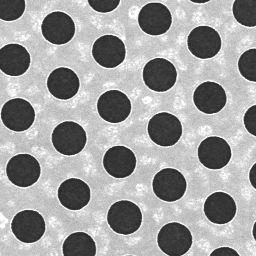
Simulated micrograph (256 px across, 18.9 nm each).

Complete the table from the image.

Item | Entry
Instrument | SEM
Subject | a regular array of holes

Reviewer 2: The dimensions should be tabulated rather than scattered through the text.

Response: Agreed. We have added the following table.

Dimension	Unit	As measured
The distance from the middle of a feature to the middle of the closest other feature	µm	1.04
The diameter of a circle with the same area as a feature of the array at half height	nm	642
